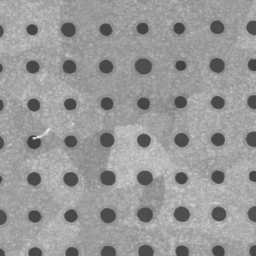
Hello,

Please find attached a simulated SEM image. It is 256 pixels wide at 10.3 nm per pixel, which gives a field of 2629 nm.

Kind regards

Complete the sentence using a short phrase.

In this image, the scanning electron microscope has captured a regular array of holes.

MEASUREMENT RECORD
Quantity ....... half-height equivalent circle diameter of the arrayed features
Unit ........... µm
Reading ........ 0.144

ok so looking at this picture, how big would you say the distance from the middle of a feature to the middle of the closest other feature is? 375 nanometres